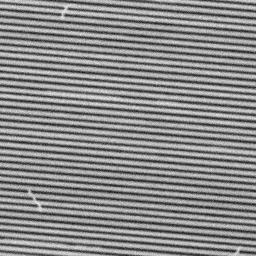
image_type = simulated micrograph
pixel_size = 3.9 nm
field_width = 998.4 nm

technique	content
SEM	parallel lines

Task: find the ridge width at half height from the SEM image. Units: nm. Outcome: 17.5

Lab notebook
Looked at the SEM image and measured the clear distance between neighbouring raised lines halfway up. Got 10.2 nm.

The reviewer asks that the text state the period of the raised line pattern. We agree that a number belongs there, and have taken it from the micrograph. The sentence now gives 6.87 pixels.